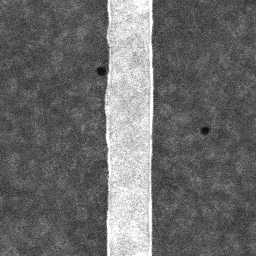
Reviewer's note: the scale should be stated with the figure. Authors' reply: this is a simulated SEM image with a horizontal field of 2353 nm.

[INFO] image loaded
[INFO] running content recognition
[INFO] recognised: one or a few lines or trenches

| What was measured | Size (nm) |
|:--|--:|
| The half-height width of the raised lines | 386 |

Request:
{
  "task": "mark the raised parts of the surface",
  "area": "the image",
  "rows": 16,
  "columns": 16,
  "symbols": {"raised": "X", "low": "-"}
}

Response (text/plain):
-------XX-------
-------XX-------
-------XX-------
-------XX-------
-------XX-------
-------XX-------
-------XX-------
-------XX-------
-------XX-------
-------XX-------
-------XX-------
-------XX-------
-------XX-------
-------XX-------
-------XX-------
-------XX-------